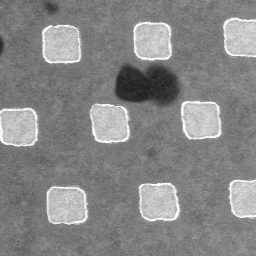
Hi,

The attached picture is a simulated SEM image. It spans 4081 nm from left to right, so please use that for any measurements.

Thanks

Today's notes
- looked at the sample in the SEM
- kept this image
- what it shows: raised bodies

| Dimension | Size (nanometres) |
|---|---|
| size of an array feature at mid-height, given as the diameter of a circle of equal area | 640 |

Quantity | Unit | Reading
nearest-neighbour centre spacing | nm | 1460